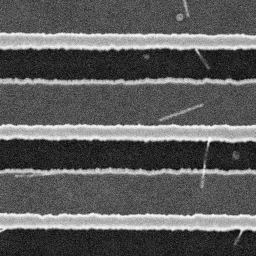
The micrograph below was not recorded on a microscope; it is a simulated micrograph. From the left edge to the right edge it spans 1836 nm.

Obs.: lines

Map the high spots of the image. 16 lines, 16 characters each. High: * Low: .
****************
****************
****************
................
................
****************
****************
****************
****************
................
................
****************
****************
****************
................
................